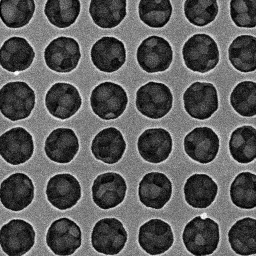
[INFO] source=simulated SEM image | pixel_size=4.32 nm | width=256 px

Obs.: a regular array of holes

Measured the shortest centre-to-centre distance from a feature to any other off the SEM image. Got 195 nm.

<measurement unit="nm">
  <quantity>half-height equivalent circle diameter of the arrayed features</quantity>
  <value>156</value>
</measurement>